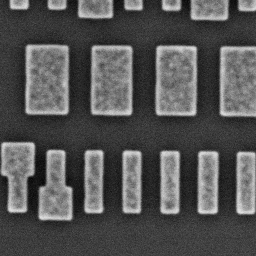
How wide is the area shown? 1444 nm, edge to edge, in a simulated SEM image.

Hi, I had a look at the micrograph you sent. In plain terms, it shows wiring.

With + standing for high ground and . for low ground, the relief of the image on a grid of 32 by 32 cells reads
.+++..++..++++..++..+++.++++..++
..........++++..........++++....
................................
................................
................................
................................
...+++++....++++....++++....++++
...+++++....++++....++++....++++
...+++++....++++....++++....++++
...+++++....++++....++++....++++
...+++++....++++....++++....++++
...+++++...+++++....++++....++++
...+++++...+++++....++++....++++
...+++++...+++++....++++....++++
................................
................................
................................
................................
++++............................
++++..++...++..+++..++...++...++
++++..++...++..+++..++...++...++
++++..++...++..+++..++...++...++
.++...++...++..+++..++...++...++
.++..++++..++..+++..++...++...++
.++..++++..++..+++..++...++...++
.++..++++..++..+++..++...++...++
.....++++..+....+...++...++...++
................................
................................
................................
................................
................................